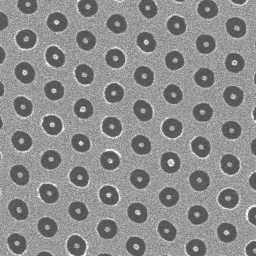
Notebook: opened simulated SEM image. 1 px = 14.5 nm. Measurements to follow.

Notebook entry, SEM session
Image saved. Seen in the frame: a regular array of ring-shaped grooves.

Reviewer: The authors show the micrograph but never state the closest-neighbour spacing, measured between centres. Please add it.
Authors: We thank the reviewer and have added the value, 0.489 micrometres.